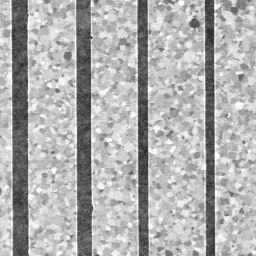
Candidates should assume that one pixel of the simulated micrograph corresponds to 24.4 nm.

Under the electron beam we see one or a few lines or trenches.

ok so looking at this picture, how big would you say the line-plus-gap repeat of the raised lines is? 1520 nm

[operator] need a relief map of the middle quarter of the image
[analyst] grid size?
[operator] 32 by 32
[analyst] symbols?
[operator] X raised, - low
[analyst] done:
XXX----XXXXXXXXXXX---XXXXXXXXXXX
XXX----XXXXXXXXXXX---XXXXXXXXXXX
XXX----XXXXXXXXXXX---XXXXXXXXXXX
XXX----XXXXXXXXXXX---XXXXXXXXXXX
XXX----XXXXXXXXXXX---XXXXXXXXXXX
XXX----XXXXXXXXXXX---XXXXXXXXXXX
XXX----XXXXXXXXXXX---XXXXXXXXXXX
XXX----XXXXXXXXXXX---XXXXXXXXXXX
XXX----XXXXXXXXXXX---XXXXXXXXXXX
XXX----XXXXXXXXXXX---XXXXXXXXXXX
XXX----XXXXXXXXXXX---XXXXXXXXXXX
XXX----XXXXXXXXXXX---XXXXXXXXXXX
XXX----XXXXXXXXXXX---XXXXXXXXXXX
XXX----XXXXXXXXXXX---XXXXXXXXXXX
XXX----XXXXXXXXXXX---XXXXXXXXXXX
XXX----XXXXXXXXXXX---XXXXXXXXXXX
XXX----XXXXXXXXXXX---XXXXXXXXXXX
XXX----XXXXXXXXXXX---XXXXXXXXXXX
XXX----XXXXXXXXXXX---XXXXXXXXXXX
XXX----XXXXXXXXXXX---XXXXXXXXXXX
XXX----XXXXXXXXXXX---XXXXXXXXXXX
XXX----XXXXXXXXXXX---XXXXXXXXXXX
XXX----XXXXXXXXXXX---XXXXXXXXXXX
XXX----XXXXXXXXXXX---XXXXXXXXXXX
XXX----XXXXXXXXXXX---XXXXXXXXXXX
XXX----XXXXXXXXXXX---XXXXXXXXXXX
XXX----XXXXXXXXXXX---XXXXXXXXXXX
XXX----XXXXXXXXXXX---XXXXXXXXXXX
XXX----XXXXXXXXXXX---XXXXXXXXXXX
XXX----XXXXXXXXXXX---XXXXXXXXXXX
XXX----XXXXXXXXXXX---XXXXXXXXXXX
XXX----XXXXXXXXXXX---XXXXXXXXXXX